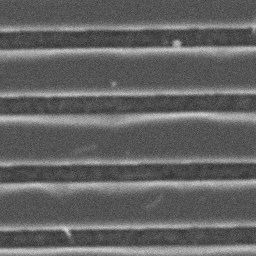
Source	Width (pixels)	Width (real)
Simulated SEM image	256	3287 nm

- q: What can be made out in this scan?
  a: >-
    lines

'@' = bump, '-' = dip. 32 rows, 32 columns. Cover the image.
@@@@@@@@@@@@@@@@@@@@@@@@@@@@@@@@
@@@@@@@@@@@@@@@@@@@@@@@@@@@@@@@@
@@@@@@@@@@@@@@@@@@@@@@@@@@@@@@@@
@@@@@@@@@@@@@@@@@@@@@@@@-@------
--------------------------------
--------------------------------
-@@@@@@@@@@@@@@@@@@@@@@@@@@@@@@@
@@@@@@@@@@@@@@@@@@@@@@@@@@@@@@@@
@@@@@@@@@@@@@@@@@@@@@@@@@@@@@@@@
@@@@@@@@@@@@@@@@@@@@@@@@@@@@@@@@
@@@@@@@@@@@@@@@@@@@@@@@@@@@@@@@@
@@@@@@@@@@@@@@@@@@@@@@@@@@@@@@@@
--------------------------------
--------------------------------
-------------------@@@@@@@@@-@--
@@@@@@@@@@@@@@@@@@@@@@@@@@@@@@@@
@@@@@@@@@@@@@@@@@@@@@@@@@@@@@@@@
@@@@@@@@@@@@@@@@@@@@@@@@@@@@@@@@
@@@@@@@@@@@@@@@@@@@@@@@@@@@@@@@@
@@@@@@@@@@@@@@@@@@@@@@@@@@@@@@@@
@@@@@@@@@-----------------------
--------------------------------
--------------------------------
@@@@@@@@@@@@@@@@@@@@@@@@@@@@@@@@
@@@@@@@@@@@@@@@@@@@@@@@@@@@@@@@@
@@@@@@@@@@@@@@@@@@@@@@@@@@@@@@@@
@@@@@@@@@@@@@@@@@@@@@@@@@@@@@@@@
@@@@@@@@@@@@@@@@@@@@@@@@@@@@@@@@
@@@@@@@@@@@@@@@@----------------
--------------------------------
--------------------------------
@@@@@@@@@@@@@@@@@@@@@@@@@@@@@@@@